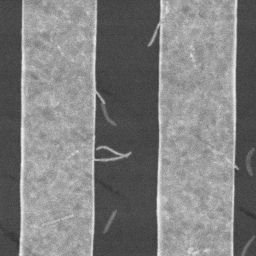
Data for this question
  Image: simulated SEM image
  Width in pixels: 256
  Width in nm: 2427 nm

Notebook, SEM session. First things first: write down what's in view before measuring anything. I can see wiring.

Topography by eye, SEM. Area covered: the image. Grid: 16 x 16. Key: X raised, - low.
-XXXXX----XXXXX-
-XXXXX----XXXXX-
-XXXXX----XXXXX-
-XXXXX----XXXXX-
-XXXXX----XXXXX-
-XXXXX----XXXXX-
-XXXXX----XXXXX-
-XXXXX----XXXXX-
-XXXXX----XXXXX-
-XXXXX----XXXXX-
-XXXXX----XXXXX-
-XXXXX----XXXXX-
-XXXXX----XXXXX-
-XXXXX----XXXXX-
-XXXXX----XXXXX-
-XXXXX----XXXXX-